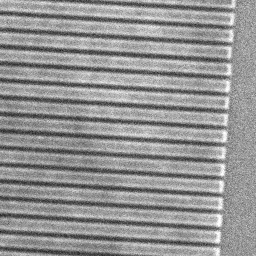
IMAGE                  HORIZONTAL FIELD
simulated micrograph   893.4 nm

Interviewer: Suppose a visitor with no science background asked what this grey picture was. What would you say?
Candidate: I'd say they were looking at parallel lines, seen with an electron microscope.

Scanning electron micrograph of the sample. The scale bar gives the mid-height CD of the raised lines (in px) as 9.48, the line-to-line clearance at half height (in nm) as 23.9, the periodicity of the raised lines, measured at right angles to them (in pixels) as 16.8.